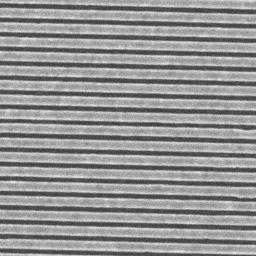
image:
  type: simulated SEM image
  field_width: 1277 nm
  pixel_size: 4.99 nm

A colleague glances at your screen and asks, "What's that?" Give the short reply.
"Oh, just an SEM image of parallel lines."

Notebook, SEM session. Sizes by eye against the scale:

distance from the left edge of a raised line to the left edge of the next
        72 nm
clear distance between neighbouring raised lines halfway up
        31.8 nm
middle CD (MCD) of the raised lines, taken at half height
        0.0418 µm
